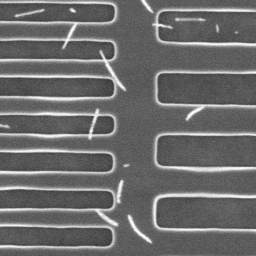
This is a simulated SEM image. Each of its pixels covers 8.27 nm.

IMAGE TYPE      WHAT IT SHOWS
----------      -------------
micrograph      groups of lines, slits or small figures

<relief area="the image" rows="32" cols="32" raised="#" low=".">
..............##################
..............######............
..............######............
####################............
####################............
..............############......
..............##################
..###.#.....####################
################################
####################............
..............######............
..............######............
####################............
################################
...........#..##################
..............##################
..............##################
####################............
###################.............
..............#####.............
..............######............
#...######...###################
################################
##.#############################
..............#######......#####
..............#####.............
###################.............
###################.............
.............#######............
..............##################
..............##################
################################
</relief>